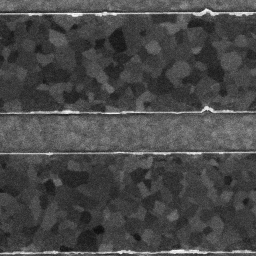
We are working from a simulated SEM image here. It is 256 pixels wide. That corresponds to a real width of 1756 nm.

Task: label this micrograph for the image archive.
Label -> one or a few lines or trenches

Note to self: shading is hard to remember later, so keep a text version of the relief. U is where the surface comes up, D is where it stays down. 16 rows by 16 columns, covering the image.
DDDDDDDDDDDDDDDD
UUUUUUUUUUUUUUUU
UUUUUUUUUUUUUUUU
UUUUUUUUUUUUUUUU
UUUUUUUUUUUUUUUU
UUUUUUUUUUUUUUUU
UUUUUUUUUUUUUUUU
DDDDDDDDDDDDDDDD
DDDDDDDDDDDDDDDD
DDDDDDDDDDDDDDDD
UUUUUUUUUUUUUUUU
UUUUUUUUUUUUUUUU
UUUUUUUUUUUUUUUU
UUUUUUUUUUUUUUUU
UUUUUUUUUUUUUUUU
UUUUUUUUUUUUUUUU